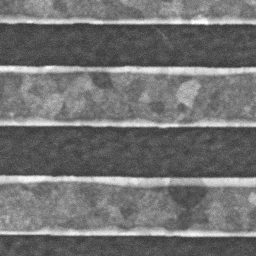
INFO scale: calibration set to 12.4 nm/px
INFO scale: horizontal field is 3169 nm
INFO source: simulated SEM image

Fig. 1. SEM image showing lines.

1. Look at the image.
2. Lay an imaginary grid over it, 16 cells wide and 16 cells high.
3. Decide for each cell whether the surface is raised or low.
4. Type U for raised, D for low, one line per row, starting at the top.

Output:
UUUUUUUUUUUUUUUU
DDDDDDDDDDDDDDDD
DDDDDDDDDDDDDDDD
DDDDDDDDDDDDDDDD
UUUUUUUUUUUUUUUU
UUUUUUUUUUUUUUUU
UUUUUUUUUUUUUUUU
UUUUUUUUUUUUUUUU
DDDDDDDDDDDDDDDD
DDDDDDDDDDDDDDDD
DDDDDDDDDDDDDDDD
UUUUUUUUUUUUUUUU
UUUUUUUUUUUUUUUU
UUUUUUUUUUUUUUUU
UUUUUUUUUUUUUUUU
DDDDDDDDDDDDDDDD